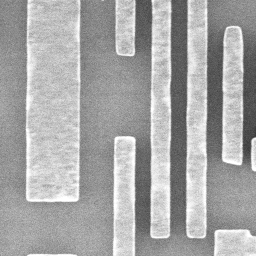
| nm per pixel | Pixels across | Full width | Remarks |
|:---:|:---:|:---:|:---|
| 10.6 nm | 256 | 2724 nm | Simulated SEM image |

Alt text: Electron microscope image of wiring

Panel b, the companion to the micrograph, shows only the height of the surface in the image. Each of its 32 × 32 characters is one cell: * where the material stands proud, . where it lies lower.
....******.....**..**...**......
....******.....**..**...**......
...*******.....**..**...**......
...*******.....**..**...**...*..
...*******.....**..**...**..**..
...*******.....**..**...**..**..
...*******.....**..**...**..**..
...*******.........**...**..**..
...*******.........**...**..**..
...*******.........**...**..**..
...*******.........**...**..**..
...*******.........**...**..**..
...*******.........**...**..**..
...*******.........**..***..**..
...*******.........**..***..**..
...*******.........**..***..**..
...*******.........**..***..**..
...*******....***..**..***..**..
...*******....***..**..***..**.*
...*******....***..**..***..**.*
...*******....***..**..***...*..
...*******....***..**..***......
...*******....***..**..***......
...*******....***..**..***......
...*******....***..**..***......
..............***..**..***......
..............***..**..***......
..............***..**..***......
..............***..**..***......
..............***..**...*..*****
..............***..........*****
..............***..........*****